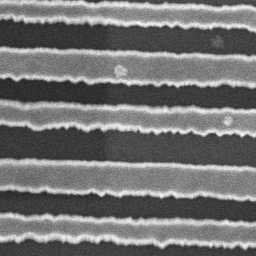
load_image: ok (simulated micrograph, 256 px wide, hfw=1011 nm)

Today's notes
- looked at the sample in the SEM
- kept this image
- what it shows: lines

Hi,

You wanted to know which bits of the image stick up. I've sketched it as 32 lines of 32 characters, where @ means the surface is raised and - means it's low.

@@@@@@@@@@@@@@@@@@@-------------
@@@@@@@@@@@@@@@@@@@@@@@@@@@@@@@@
--@@@@@@@@@@@@@@@@@@@@@@@@@@@@@@
-----------------------@-@@-@@@@
--------------------------------
--------------------------------
@@@@@@@@@@@@@@@@@@--------------
@@@@@@@@@@@@@@@@@@@@@@@@@@@@@@@@
@@@@@@@@@@@@@@@@@@@@@@@@@@@@@@@@
@@@@@@@@@@@@@@@@@@@@@@@@@@@@@@@@
-----------@----@@@@@@@@@@@@@@@@
--------------------------------
--------------------------------
@@@@@@@@@@@@@@@@@@@@@@@@@-------
@@@@@@@@@@@@@@@@@@@@@@@@@@@@@@@@
@@@@@@@@@@@@@@@@@@@@@@@@@@@@@@@@
------------------@@--@@@@@@@@@@
--------------------------------
--------------------------------
--------------------------------
@@@@@@@@@@@@@@@@@@@@@@----------
@@@@@@@@@@@@@@@@@@@@@@@@@@@@@@@@
@@@@@@@@@@@@@@@@@@@@@@@@@@@@@@@@
@@@@@@@@@@@@@@@@@@@@@@@@@@@@@@@@
--------------@----@@-@@@@@@@@@@
--------------------------------
--------------------------------
@@@@@@@@@@@@@@@@@@@@@@@@-@@-----
@@@@@@@@@@@@@@@@@@@@@@@@@@@@@@@@
@@@@@@@@@@@@@@@@@@@@@@@@@@@@@@@@
---------------@@@@@@@@@@@@@@@@@
--------------------------------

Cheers